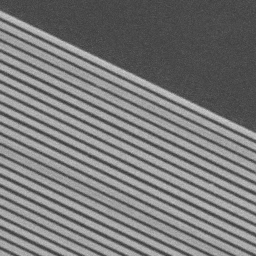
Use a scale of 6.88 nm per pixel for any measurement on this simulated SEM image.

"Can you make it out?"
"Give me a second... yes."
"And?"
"parallel lines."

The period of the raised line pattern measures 0.0645 microns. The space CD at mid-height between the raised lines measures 25.6 nm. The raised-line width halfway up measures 0.0396 um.